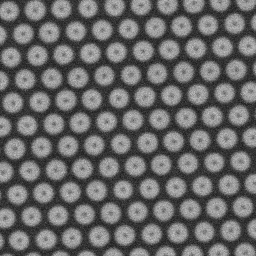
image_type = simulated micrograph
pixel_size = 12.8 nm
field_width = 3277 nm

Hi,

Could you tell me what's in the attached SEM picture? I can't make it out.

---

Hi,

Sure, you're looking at an array of small figures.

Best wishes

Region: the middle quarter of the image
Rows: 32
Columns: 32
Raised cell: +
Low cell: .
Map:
......................+++...++++
..+++...++++...++++..++++...++++
.+++++..++++..+++++..+++++..++++
.+++++..++++...++++..++++...++++
.+++++..++++...+++....++........
..+++...........................
.............++....+++...++++..+
+++..++++...++++..+++++..++++..+
+++..++++..+++++..+++++..++++..+
+++..++++...++++..++++...++++...
++...++++...+++....++...........
.............................+++
...++....+++...++++...++++..++++
..++++..+++++..++++...++++..++++
..++++..+++++..+++++..++++..++++
..++++...++++..++++...++++...+++
..++++....++....................
....................++....+++...
++....+++....+++...++++..+++++..
+++..+++++..++++...++++..+++++..
+++..+++++..++++...++++..+++++..
+++...++++..++++...++++...+++...
++.....+........................
.................++....+++...+++
...+++...++++...++++..+++++..+++
..+++++..++++..+++++..+++++..+++
..+++++..+++++..++++..++++...+++
...++++..++++....++.............
....+...........................
.......++.....++....+++...++++..
+++...++++...++++..+++++..++++..
++++..++++...++++..+++++..++++..